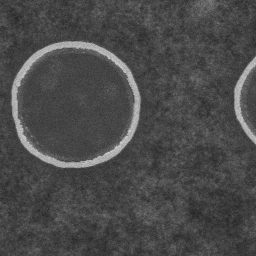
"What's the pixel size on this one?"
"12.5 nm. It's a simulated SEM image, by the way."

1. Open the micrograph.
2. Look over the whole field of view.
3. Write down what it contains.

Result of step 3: raised bodies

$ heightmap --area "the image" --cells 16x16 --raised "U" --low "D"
DDDDDDDDDDDDDDDD
DDDDDDDDDDDDDDDD
DDDDDDDDDDDDDDDD
DDUUUUUDDDDDDDDD
DUUUUUUUDDDDDDDU
DUUUUUUUDDDDDDDU
DUUUUUUUUDDDDDDU
DUUUUUUUDDDDDDDU
DUUUUUUUDDDDDDDD
DDUUUUUDDDDDDDDD
DDDDDDDDDDDDDDDD
DDDDDDDDDDDDDDDD
DDDDDDDDDDDDDDDD
DDDDDDDDDDDDDDDD
DDDDDDDDDDDDDDDD
DDDDDDDDDDDDDDDD